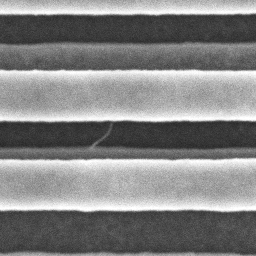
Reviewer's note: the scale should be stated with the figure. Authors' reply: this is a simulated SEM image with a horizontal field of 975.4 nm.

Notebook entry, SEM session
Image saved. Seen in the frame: lines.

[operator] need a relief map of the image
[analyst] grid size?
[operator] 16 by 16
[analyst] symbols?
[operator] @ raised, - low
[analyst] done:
@@@@@@@@@@@@@@@@
----------------
----------------
----------------
@@@@@@@@@@@@@@@@
@@@@@@@@@@@@@@@@
@@@@@@@@@@@@@@@@
@@@@@@@@@@@@@@@@
----------------
----------------
@@@@@@@@@@@@@@@@
@@@@@@@@@@@@@@@@
@@@@@@@@@@@@@@@@
----------------
----------------
----------------